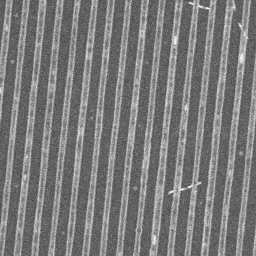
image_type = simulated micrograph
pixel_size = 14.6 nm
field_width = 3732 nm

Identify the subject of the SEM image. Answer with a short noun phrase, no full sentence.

parallel lines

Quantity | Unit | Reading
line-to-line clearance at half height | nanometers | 160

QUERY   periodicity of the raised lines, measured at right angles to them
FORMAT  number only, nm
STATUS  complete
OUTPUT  247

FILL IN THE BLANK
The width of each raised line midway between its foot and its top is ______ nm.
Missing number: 79.7